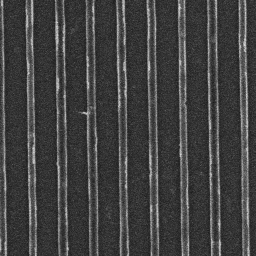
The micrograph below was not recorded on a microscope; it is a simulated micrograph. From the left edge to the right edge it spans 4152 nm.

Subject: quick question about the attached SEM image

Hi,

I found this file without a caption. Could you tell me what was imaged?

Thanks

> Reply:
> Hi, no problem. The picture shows parallel lines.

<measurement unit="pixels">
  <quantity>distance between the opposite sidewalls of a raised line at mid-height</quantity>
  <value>7.87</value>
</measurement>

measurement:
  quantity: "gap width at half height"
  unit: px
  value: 23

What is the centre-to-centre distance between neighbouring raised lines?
494 nanometers